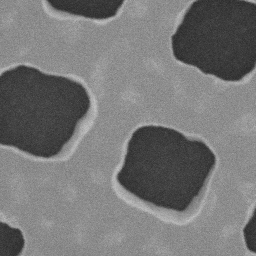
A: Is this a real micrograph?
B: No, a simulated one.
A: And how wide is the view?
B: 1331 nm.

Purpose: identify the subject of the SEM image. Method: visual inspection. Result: holes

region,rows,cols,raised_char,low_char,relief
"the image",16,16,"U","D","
UUUDDDDUUUUUDDDD
UUUUUUUUUUUDDDDD
UUUUUUUUUUUDDDDD
UUUUUUUUUUUDDDDD
DDDUUUUUUUUUUDDD
DDDDDUUUUUUUUUUU
DDDDDDUUUUUUUUUU
DDDDDUUUUUUUUUUU
DDDDDUUUDDDDUUUU
UUDDUUUUDDDDDUUU
UUUUUUUUDDDDDUUU
UUUUUUUUDDDDDUUU
UUUUUUUUUDDDDUUU
UUUUUUUUUUUUUUUU
DUUUUUUUUUUUUUUD
DUUUUUUUUUUUUUUU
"